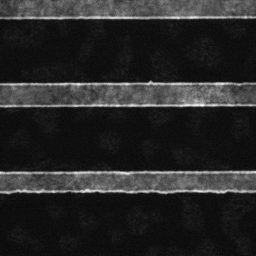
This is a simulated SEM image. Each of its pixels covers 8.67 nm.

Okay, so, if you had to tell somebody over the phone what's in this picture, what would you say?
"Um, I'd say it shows one or a few lines or trenches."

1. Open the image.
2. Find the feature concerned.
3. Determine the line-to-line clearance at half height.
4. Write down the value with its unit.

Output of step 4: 580 nm